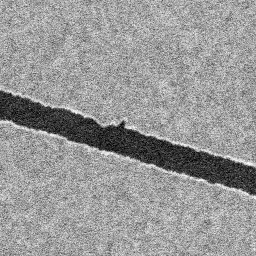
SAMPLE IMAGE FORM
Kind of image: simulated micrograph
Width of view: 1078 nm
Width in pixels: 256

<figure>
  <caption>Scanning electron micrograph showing one or a few lines or trenches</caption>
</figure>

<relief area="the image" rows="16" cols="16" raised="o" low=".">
oooooooooooooooo
oooooooooooooooo
oooooooooooooooo
oooooooooooooooo
oooooooooooooooo
oooooooooooooooo
...ooooooooooooo
......oooooooooo
oooo......oooooo
oooooo.......ooo
oooooooooo......
ooooooooooooo...
oooooooooooooooo
oooooooooooooooo
oooooooooooooooo
oooooooooooooooo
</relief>